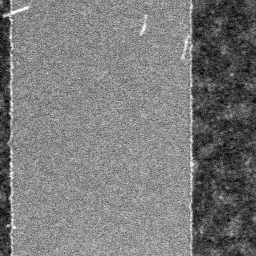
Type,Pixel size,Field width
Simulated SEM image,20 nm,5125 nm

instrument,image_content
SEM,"one or a few lines or trenches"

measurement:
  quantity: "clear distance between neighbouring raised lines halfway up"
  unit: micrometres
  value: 3.59